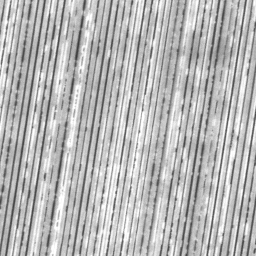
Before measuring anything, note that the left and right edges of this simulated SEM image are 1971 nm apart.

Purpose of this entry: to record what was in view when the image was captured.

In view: parallel lines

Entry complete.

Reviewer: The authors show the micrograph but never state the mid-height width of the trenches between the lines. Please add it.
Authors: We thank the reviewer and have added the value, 15.2 nm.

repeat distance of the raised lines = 0.0511 um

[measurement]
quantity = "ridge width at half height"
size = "38.1 nm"